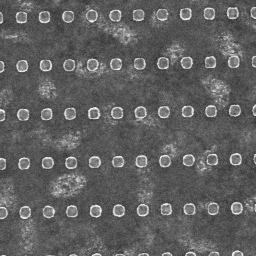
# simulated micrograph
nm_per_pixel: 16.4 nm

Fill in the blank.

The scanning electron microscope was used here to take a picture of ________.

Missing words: a regular array of raised bodies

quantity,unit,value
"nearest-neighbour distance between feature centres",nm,384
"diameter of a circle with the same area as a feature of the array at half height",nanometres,187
